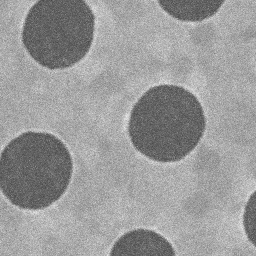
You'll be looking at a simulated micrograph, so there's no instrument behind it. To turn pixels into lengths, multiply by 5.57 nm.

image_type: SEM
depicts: holes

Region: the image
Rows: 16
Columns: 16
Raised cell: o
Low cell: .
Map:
oo....oooo....oo
o.....oooooooooo
o.....oooooooooo
oo...ooooooooooo
oooooooooooooooo
ooooooooo...oooo
oooooooo.....ooo
oooooooo.....ooo
o..ooooo.....ooo
....ooooo...oooo
.....ooooooooooo
....oooooooooooo
....ooooooooooo.
ooooooooooooooo.
oooooooo..ooooo.
ooooooo....ooooo